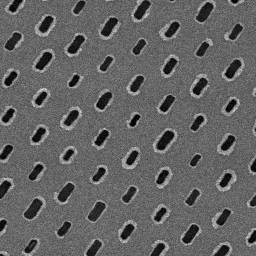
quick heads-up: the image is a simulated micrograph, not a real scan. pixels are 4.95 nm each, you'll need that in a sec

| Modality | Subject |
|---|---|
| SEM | a regular array of holes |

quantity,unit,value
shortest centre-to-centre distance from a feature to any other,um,0.179